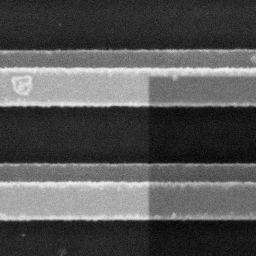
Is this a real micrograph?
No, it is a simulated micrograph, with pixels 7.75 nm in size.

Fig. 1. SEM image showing lines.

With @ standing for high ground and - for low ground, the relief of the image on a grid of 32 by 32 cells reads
--------------------------------
--------------------------------
--------------------------------
--------------------------------
--------------------------------
--------------------------------
@@@@@@@@@@@@@@@@@@@@@@@@@@@@@@@@
@@@@@@@@@@@@@@@@@@@@@@@@@@@@@@@@
@@@@@@@@@@@@@@@@@@@@@@@@@@@@@@@@
@@@@@@@@@@@@@@@@@@@@@@@@@@@@@@@@
@@@@@@@@@@@@@@@@@@@@@@@@@@@@@@@@
@@@@@@@@@@@@@@@@@@@@@@@@@@@@@@@@
@@@@@@@@@@@@@@@@@@@@@@@@@@@@@@@@
--------------------------------
--------------------------------
--------------------------------
--------------------------------
--------------------------------
--------------------------------
--------------------------------
--------------------------------
@@@@@@@@@@@@@@@@@@@@@@@@@@@@@@@@
@@@@@@@@@@@@@@@@@@@@@@@@@@@@@@@@
@@@@@@@@@@@@@@@@@@@@@@@@@@@@@@@@
@@@@@@@@@@@@@@@@@@@@@@@@@@@@@@@@
@@@@@@@@@@@@@@@@@@@@@@@@@@@@@@@@
@@@@@@@@@@@@@@@@@@@@@@@@@@@@@@@@
@-@-----------------------------
--------------------------------
--------------------------------
--------------------------------
--------------------------------